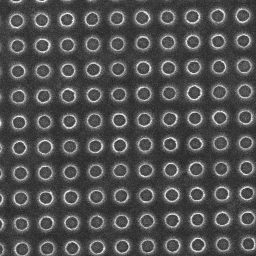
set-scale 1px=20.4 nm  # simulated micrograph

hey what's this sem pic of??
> a regular array of holes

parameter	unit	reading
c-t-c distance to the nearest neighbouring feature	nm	510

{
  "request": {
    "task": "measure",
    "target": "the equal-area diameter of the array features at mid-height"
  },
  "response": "253 nm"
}